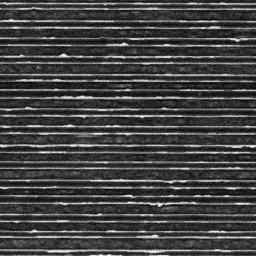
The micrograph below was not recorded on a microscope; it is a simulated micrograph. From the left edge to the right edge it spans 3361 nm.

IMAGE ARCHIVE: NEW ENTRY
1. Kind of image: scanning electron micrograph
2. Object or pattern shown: parallel lines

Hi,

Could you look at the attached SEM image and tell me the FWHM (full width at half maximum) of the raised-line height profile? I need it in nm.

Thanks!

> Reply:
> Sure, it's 100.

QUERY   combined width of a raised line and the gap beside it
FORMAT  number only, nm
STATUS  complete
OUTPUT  231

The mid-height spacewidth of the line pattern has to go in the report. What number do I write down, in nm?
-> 123